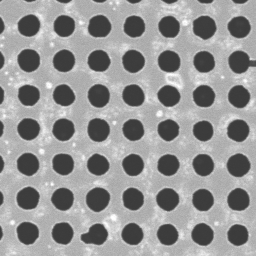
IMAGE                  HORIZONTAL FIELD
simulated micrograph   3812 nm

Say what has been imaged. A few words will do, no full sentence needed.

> a regular array of holes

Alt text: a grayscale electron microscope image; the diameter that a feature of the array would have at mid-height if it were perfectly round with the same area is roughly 337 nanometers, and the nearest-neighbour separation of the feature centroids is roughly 511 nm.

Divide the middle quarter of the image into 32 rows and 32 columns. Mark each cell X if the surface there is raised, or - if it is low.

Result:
---XXX-----XXXX-----XXXX-----XXX
--XXXXX---XXXXX----XXXXX-----XXX
XXXXXXXXXXXXXXXXXXXXXXXXXXXXXXXX
XXXXXXXXXXXXXXXXXXXXXXXXXXXXXXXX
XXXXXXXXXXXXXXXXXXXXXXXXXXXXXXXX
-XXXXXX---XXXXX----XXXXXX--XXXXX
--XXXX-----XXXX-----XXXX----XXXX
---XXX-----XXXX-----XXX------XXX
---XXX-----XXXX-----XXXX-----XXX
--XXXX-----XXXX-----XXXX----XXXX
-XXXXXX---XXXXXXX--XXXXXX--XXXXX
XXXXXXXXXXXXXXXXXXXXXXXXXXXXXXXX
XXXXXXXXXXXXXXXXXXXXXXXXXXXXXXXX
XXXXXXX--XXXXXXXXXXXXXXXXXXXXXXX
--XXXX-----XXXXX---XXXXX----XXXX
--XXXX-----XXXX-----XXX------XXX
---XXX------XXX-----XXX------XXX
--XXXX-----XXXX-----XXX------XXX
--XXXX-----XXXXX---XXXXX----XXXX
XXXXXXXX-XXXXXXXXXXXXXXXXXXXXXXX
XXXXXXXXXXXXXXXXXXXXXXXXXXXXXXXX
XXXXXXXXXXXXXXXXXXXXXXXXXXXXXXXX
-XXXXXX--XXXXXXX--XXXXXXXXXXXXXX
--XXXX-----XXXX----XXXXX----XXXX
--XXXX-----XXX------XXX------XXX
---XXX------XX------XXX------XXX
--XXXX-----XXXX-----XXX------XXX
-XXXXXX---XXXXXX---XXXXX----XXXX
XXXXXXXXXXXXXXXXXXXXXXXXXXXXXXXX
XXXXXXXXXXXXXXXXXXXXXXXXXXXXXXXX
XXXXXXXXXXXXXXXXXXXXXXXXXXXXXXXX
--XXXXX---XXXXX----XXXXX----XXXX